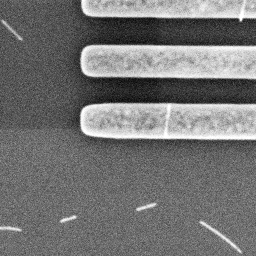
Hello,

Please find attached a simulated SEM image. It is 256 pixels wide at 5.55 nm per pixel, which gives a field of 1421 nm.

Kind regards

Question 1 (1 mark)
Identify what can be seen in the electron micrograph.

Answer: wiring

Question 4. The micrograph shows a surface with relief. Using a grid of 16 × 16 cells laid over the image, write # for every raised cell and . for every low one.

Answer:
.....###########
................
................
.....###########
.....###########
................
................
.....###########
......##########
................
................
................
................
................
................
................